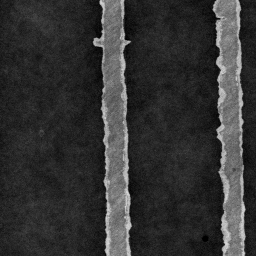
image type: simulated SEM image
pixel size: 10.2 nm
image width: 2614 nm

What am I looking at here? one or a few lines or trenches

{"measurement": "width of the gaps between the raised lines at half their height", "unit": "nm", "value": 975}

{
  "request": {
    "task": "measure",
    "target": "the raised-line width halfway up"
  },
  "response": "207 nm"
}